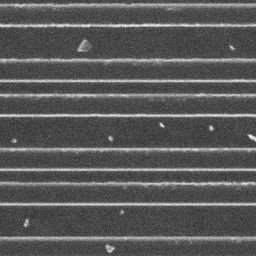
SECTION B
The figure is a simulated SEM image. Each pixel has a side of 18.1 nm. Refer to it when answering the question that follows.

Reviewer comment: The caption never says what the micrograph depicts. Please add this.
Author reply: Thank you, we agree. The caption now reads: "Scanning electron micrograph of lines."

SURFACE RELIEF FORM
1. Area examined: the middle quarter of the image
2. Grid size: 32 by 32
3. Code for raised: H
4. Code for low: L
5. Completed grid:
HHHHHHHHHHHHHHHHHHHHHHHHHHHHHHHH
HHHHHHHHHHHHHHHHHHHHHHHHHHHHHHHH
HHHHHHHHHHHHHHHHHHHHHHHHHHHHHHHH
HHHHHHHHHHHHHHHHHHHHHHHHHHHHHHHH
LLLLLLLLLLLLLLLLLLLLLLLLLLLLLLLL
LLLLLLLLLLLLLLLLLLLLLLLLLLLLLLLL
LLLLLLLLLLLLLLLLLLLLLLLLLLLLLLLL
LLLLLLLLLLLLLLLLLLLLLLLLLLLLLLLL
HHHHHHHHHHHHHHHHHHHHHHHHHHHHHHHH
HHHHHHHHHHHHHHHHHHHHHHHHHHHHHHHH
HHHHHHHHHHHHHHHHHHHHHHHHHHHHHHHH
HHHHHHHHHHHHHHHHHHHHHHHHHHHHHHHH
HHHHHHHHHHHHHHHHHHHHHHHHHHHHHHHH
LLLLLLLLLLLLLLLLLLLLLLLLLLLLLLLL
LLLLLLLLLLLLLLLLLLLLLLLLLLLLLLLL
LLLLLLLLLLLLLLLLLLLLLLLLLLLLLLLL
LLLLLLLLLLLLLLLLLLLLLLLLLLLLLLLL
LLLLLLLLLLLLLLLLLLLLLLLLLLLLLLLL
LLLLLLLLLLLLLLLLLLLLLLLLLLLLLLLL
LLLLLLLLLLLLLLLLLLLLLLLLLLLLLLLL
LLLLLLLLLLLLLLLLLLLLLLLLLLLLLLLL
HHHHHHHHHHHHHHHHHHHHHHHHHHHHHHHH
HHHHHHHHHHHHHHHHHHHHHHHHHHHHHHHH
HHHHHHHHHHHHHHHHHHHHHHHHHHHHHHHH
HHHHHHHHHHHHHHHHHHHHHHHHHHHHHHHH
HHHHHHHHHHHHHHHHHHHHHHHHHHHHHHHH
LLLLLLLLLLLLLLLLLLLLLLLLLLLLLLLL
LLLLLLLLLLLLLLLLLLLLLLLLLLLLLLLL
LLLLLLLLLLLLLLLLLLLLLLLLLLLLLLLL
LLLLLLLLLLLLLLLLLLLLLLLLLLLLLLLL
HHHHHHHHHHHHHHHHHHHHHHHHHHHHHHHH
HHHHHHHHHHHHHHHHHHHHHHHHHHHHHHHH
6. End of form